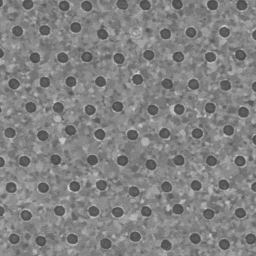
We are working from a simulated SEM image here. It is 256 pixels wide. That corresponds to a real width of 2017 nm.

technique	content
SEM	a regular array of holes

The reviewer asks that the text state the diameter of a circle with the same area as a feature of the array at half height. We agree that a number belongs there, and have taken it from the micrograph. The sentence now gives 91.1 nanometers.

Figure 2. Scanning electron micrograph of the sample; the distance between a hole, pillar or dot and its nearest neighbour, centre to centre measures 213 nm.